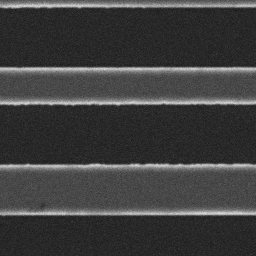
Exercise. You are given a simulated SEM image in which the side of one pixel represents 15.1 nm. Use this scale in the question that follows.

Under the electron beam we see lines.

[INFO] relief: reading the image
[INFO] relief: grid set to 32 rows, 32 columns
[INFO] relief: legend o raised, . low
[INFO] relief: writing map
oooooooooooooooooooooooooooooooo
................................
................................
................................
................................
................................
................................
................................
................................
oooooooooooooooooooooooooooooooo
oooooooooooooooooooooooooooooooo
oooooooooooooooooooooooooooooooo
oooooooooooooooooooooooooooooooo
................................
................................
................................
................................
................................
................................
................................
................................
oooooooooooooooooooooooooooooooo
oooooooooooooooooooooooooooooooo
oooooooooooooooooooooooooooooooo
oooooooooooooooooooooooooooooooo
oooooooooooooooooooooooooooooooo
oooooooooooooooooooooooooooooooo
................................
................................
................................
................................
................................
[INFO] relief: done